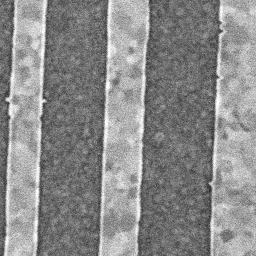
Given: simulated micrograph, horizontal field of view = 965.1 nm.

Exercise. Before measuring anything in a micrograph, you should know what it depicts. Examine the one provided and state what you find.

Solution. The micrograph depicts one or a few lines or trenches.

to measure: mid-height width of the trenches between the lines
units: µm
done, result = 0.261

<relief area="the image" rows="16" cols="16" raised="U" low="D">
DUUDDDDUUDDDDDUU
DUUDDDDUUDDDDDUU
DUUDDDDUUDDDDDUU
DUUDDDDUUDDDDDUU
DUUDDDDUUDDDDDUU
DUUDDDDUUDDDDDUU
DUUDDDDUUDDDDDUU
DUUDDDDUUDDDDDUU
DUDDDDDUUDDDDUUU
DUDDDDDUUDDDDUUU
DUDDDDUUUDDDDUUU
UUDDDDUUUDDDDUUU
UUDDDDUUUDDDDUUU
UUDDDDUUUDDDDUUU
UUDDDDUUUDDDDUUU
UUDDDDUUUDDDDUUU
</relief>